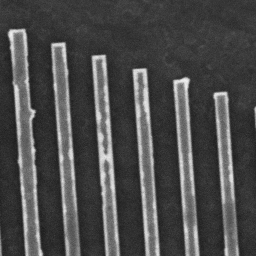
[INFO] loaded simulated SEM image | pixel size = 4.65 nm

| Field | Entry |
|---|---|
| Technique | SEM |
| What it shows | parallel lines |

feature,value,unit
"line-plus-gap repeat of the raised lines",184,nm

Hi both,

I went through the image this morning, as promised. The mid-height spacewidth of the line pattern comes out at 122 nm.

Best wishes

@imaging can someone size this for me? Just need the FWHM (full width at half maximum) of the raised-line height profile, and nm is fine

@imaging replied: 59.1